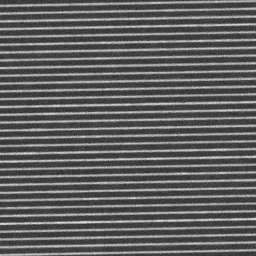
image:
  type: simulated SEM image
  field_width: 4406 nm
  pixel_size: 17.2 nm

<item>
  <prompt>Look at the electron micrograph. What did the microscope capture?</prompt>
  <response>parallel lines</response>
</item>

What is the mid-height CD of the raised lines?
1.75 px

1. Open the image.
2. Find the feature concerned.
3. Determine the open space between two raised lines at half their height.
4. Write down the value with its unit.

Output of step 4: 0.108 um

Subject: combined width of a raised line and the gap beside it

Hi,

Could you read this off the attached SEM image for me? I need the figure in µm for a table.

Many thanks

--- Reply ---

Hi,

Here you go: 0.134